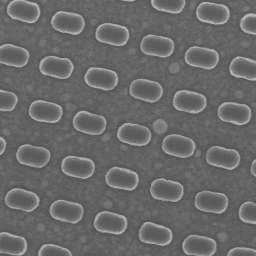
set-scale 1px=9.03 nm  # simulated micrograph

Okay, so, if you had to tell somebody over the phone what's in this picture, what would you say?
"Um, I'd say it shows a regular array of raised bodies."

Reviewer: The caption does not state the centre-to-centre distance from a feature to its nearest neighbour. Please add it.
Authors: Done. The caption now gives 411 nm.